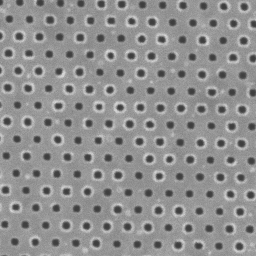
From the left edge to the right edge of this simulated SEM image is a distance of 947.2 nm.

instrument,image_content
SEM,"a regular array of holes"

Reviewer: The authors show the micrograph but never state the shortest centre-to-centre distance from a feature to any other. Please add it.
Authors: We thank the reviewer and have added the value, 0.0727 micrometres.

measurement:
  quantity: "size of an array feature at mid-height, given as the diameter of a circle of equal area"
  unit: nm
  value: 28.3